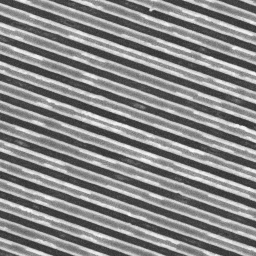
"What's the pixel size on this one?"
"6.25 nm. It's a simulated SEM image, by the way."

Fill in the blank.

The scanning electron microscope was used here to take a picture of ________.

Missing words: parallel lines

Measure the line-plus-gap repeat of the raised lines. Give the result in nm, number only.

115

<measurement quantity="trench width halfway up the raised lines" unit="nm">58.2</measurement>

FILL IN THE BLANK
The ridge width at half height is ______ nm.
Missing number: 58.2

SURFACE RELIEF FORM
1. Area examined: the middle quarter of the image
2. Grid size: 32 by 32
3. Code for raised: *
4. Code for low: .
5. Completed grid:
........*******.......*******...
***........******........******.
******.......*******.......*****
..*******........******.......**
.....*******.......*******......
*.......*******.......*******...
****.......*******.......*******
******........*******.......****
...*******.......******........*
......******........******......
*........******.......*******...
****.......*******........******
*******.......*******.......****
...******........*******.......*
......******........******......
*........*******.......******...
*****.......******........******
*******........******........***
...*******.......*******........
......*******.......*******.....
**.......*******.......*******..
*****.......******........******
.*******.......*******.......***
....*******.......******........
......*******........*******....
**.......*******.......*******..
*****.......*******.......******
.*******.......*******.......***
....*******.......*******.......
.......*******.......*******....
**........*******.......*******.
*****........******........*****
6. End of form